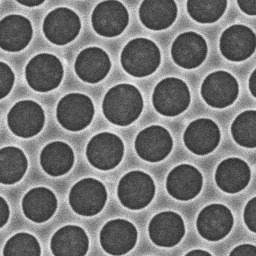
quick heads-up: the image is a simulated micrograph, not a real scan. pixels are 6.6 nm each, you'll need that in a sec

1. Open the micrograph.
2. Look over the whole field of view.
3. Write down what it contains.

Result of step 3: a regular array of holes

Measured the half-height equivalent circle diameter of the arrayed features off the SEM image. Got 252 nm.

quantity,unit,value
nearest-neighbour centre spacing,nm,321